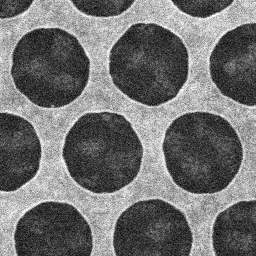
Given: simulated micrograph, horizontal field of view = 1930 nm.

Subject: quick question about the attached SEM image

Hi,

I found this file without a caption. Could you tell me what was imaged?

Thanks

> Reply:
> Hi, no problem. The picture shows holes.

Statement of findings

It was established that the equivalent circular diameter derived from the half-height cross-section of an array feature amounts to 81 pixels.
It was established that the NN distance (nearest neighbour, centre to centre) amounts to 748 nanometres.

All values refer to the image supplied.